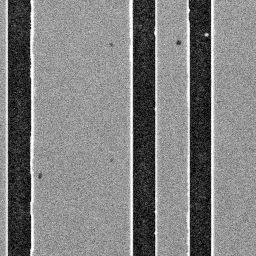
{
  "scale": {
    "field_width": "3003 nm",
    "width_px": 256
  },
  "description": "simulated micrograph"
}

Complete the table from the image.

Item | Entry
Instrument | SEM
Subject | lines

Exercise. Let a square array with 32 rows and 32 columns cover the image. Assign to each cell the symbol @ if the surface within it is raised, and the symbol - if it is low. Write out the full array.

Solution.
@---@@@@@@@@@@@@----@@@---@@@@@@
@---@@@@@@@@@@@@----@@@@--@@@@@@
@---@@@@@@@@@@@@----@@@@--@@@@@@
@---@@@@@@@@@@@@---@@@@@--@@@@@@
@---@@@@@@@@@@@@---@@@@@--@@@@@@
@---@@@@@@@@@@@@----@@@@--@@@@@@
@---@@@@@@@@@@@@----@@@@--@@@@@@
@---@@@@@@@@@@@@----@@@@--@@@@@@
@---@@@@@@@@@@@@----@@@@--@@@@@@
@---@@@@@@@@@@@@----@@@@--@@@@@@
@---@@@@@@@@@@@@----@@@@--@@@@@@
@---@@@@@@@@@@@@----@@@@--@@@@@@
@---@@@@@@@@@@@@----@@@@--@@@@@@
@---@@@@@@@@@@@@@--@@@@@--@@@@@@
@---@@@@@@@@@@@@----@@@@--@@@@@@
@---@@@@@@@@@@@@----@@@@--@@@@@@
@---@@@@@@@@@@@@----@@@@--@@@@@@
@---@@@@@@@@@@@@----@@@@--@@@@@@
@---@@@@@@@@@@@@----@@@@--@@@@@@
@---@@@@@@@@@@@@----@@@@--@@@@@@
@---@@@@@@@@@@@@----@@@@--@@@@@@
@---@@@@@@@@@@@@----@@@@--@@@@@@
@---@@@@@@@@@@@@----@@@@---@@@@@
@---@@@@@@@@@@@@@---@@@@--@@@@@@
@---@@@@@@@@@@@@----@@@@--@@@@@@
@---@@@@@@@@@@@@----@@@@--@@@@@@
@---@@@@@@@@@@@@@---@@@@---@@@@@
@---@@@@@@@@@@@@@---@@@@--@@@@@@
@---@@@@@@@@@@@@----@@@@---@@@@@
@---@@@@@@@@@@@@---@@@@@--@@@@@@
@---@@@@@@@@@@@@@---@@@@--@@@@@@
@---@@@@@@@@@@@@@---@@@@--@@@@@@